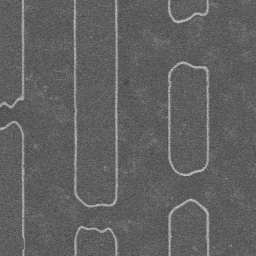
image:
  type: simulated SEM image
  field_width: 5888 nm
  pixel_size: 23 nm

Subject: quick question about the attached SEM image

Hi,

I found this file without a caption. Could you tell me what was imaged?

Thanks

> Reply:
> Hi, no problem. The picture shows one or a few lines or trenches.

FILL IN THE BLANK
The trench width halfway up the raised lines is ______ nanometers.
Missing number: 1220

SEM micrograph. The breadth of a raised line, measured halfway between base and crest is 929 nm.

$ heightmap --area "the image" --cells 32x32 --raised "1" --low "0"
11100000011111100000011111000000
11100000011111100000011111000000
11100000011111100000001000000000
11100000011111100000000000000000
11100000011111100000000000000000
11100000011111100000000000000000
11100000011111100000000000000000
11100000011111100000000000000000
11100000011111100000001110000000
11100000011111100000011111000000
11100000011111100000011111000000
11100000011111100000011111000000
11000000011111100000011111000000
00000000011111000000011111000000
00000000011111000000011111000000
01000000011111000000011111000000
11100000001111100000011111000000
11100000001111100000011111000000
11100000001111100000011111000000
11100000001111100000011111000000
11100000001111100000011111000000
11100000011111100000001100000000
11100000011111100000000000000000
11100000011111100000000000000000
11100000001111000000000000000000
11100000000111000000000110000000
11100000000000000000001111000000
11100000000000000000011111000000
11100000001000000000011111000000
11100000001111000000011111000000
11100000011111000000011111000000
11100000011111000000011111000000